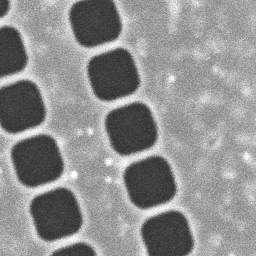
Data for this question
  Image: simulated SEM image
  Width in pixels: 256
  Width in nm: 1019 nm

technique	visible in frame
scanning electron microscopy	holes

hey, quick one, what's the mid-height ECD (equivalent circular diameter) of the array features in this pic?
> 213 nm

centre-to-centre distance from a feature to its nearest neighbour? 0.226 µm